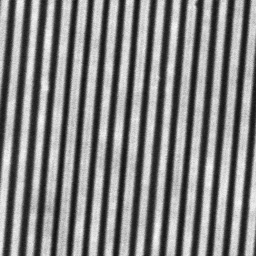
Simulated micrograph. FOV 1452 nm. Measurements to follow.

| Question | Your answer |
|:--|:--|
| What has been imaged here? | parallel lines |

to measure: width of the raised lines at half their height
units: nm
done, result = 48.7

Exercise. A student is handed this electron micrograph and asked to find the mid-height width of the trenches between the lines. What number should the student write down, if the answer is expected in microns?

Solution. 0.0388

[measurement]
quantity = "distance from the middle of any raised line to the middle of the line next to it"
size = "88.4 nm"